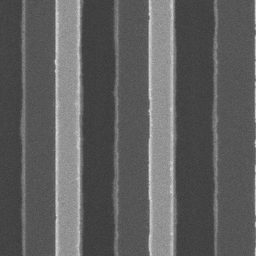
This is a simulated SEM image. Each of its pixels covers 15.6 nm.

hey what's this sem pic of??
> lines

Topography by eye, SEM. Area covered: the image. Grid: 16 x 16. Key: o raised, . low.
..ooo..oooo...oo
..ooo..oooo...oo
..ooo..oooo...oo
..ooo..oooo...oo
..ooo..oooo...oo
..ooo..oooo...oo
..ooo..oooo...oo
..ooo..oooo...oo
..ooo..oooo...oo
..ooo..oooo...oo
..ooo..oooo...oo
..ooo..oooo...oo
..ooo..oooo...oo
..ooo..oooo...oo
..ooo..oooo...oo
..ooo..oooo...oo